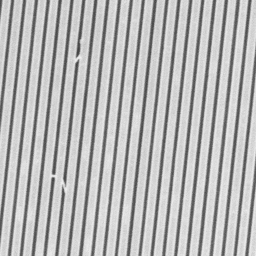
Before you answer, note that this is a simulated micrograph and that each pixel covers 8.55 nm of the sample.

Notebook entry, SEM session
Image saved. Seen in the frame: parallel lines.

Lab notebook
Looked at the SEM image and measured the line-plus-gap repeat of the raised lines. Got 101 nm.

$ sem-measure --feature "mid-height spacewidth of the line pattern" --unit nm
38.3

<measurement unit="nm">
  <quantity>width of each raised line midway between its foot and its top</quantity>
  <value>62.8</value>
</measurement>